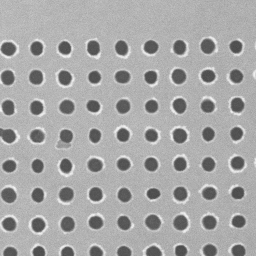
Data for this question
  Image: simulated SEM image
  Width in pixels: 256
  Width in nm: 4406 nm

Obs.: a regular array of holes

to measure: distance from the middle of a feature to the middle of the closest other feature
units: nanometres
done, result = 486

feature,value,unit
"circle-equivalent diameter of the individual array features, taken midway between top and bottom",0.242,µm